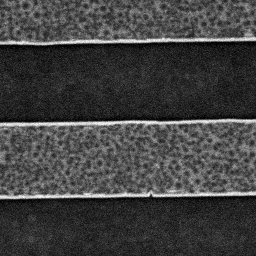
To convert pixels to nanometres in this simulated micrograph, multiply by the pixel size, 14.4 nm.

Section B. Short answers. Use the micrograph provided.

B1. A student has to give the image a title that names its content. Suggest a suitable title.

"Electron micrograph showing one or a few lines or trenches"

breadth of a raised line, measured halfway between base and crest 1050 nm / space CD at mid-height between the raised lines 1180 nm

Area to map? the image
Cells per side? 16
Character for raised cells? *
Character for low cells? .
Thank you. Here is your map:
****************
****************
************....
................
................
................
................
................
****************
****************
****************
****************
................
................
................
................